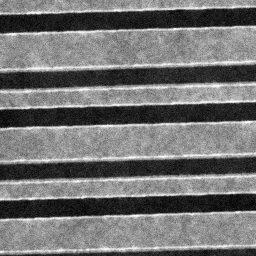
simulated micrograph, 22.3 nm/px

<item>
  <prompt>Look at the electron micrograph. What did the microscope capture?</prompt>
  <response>lines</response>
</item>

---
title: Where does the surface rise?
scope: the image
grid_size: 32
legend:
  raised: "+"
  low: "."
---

++++++++++++++++++++++++++++++++
++++++++........................
................................
.........................+++++++
++++++++++++++++++++++++++++++++
++++++++++++++++++++++++++++++++
++++++++++++++++++++++++++++++++
++++++++++++++++++++++++++++++++
++++++++........................
................................
................................
..++++++++++++++++++++++++++++++
++++++++++++++++++++++++++++++++
................................
................................
.......................+++++++++
++++++++++++++++++++++++++++++++
++++++++++++++++++++++++++++++++
++++++++++++++++++++++++++++++++
+++++++++++++++++++++++++.......
................................
................................
............++++++++++++++++++++
++++++++++++++++++++++++++++++++
+++++++++++++++.................
................................
................................
++++++++++++++++++++++++++++++++
++++++++++++++++++++++++++++++++
++++++++++++++++++++++++++++++++
++++++++++++++++++++++++++++++++
+...............................